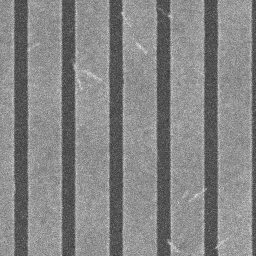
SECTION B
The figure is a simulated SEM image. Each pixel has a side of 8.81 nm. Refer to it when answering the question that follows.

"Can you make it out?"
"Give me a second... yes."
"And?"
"parallel lines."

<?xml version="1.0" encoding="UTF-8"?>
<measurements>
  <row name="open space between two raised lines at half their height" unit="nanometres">127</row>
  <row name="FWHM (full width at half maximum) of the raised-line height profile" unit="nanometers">293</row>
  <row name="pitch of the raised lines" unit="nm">418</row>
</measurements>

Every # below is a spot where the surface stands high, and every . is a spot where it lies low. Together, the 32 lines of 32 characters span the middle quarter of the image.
...########....########....#####
...########....########....#####
...########....########....#####
...########....########....#####
...########....########....#####
...########....########....#####
...########....########....#####
...########....########....#####
...########....########....#####
...########....########....#####
....#######....########....#####
...########....########....#####
...########....########....#####
...########....########....#####
...########....########....#####
...########....########....#####
...########....########....#####
...########....########....#####
...########....########....#####
...########....########....#####
...########....########....#####
...########....########....#####
...########....########....#####
...########....########....#####
...########....########....#####
...########....########....#####
...########....########....#####
...########....########....#####
...########....########....#####
...########....########....#####
...########....########....#####
...########....########....#####